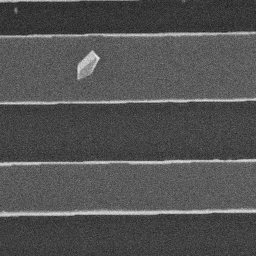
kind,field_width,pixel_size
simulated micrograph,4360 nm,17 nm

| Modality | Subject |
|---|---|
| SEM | lines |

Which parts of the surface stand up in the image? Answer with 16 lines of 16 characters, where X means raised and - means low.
----------------
----------------
XXXXXXXXXXXXXXXX
XXXXXXXXXXXXXXXX
XXXXXXXXXXXXXXXX
XXXXXXXXXXXXXXXX
----------------
----------------
----------------
----------------
XXXXXXXXXXXXXXXX
XXXXXXXXXXXXXXXX
XXXXXXXXXXXXXXXX
----------------
----------------
----------------